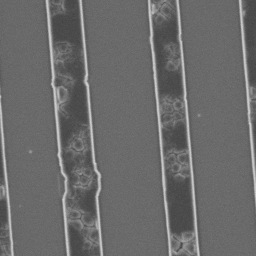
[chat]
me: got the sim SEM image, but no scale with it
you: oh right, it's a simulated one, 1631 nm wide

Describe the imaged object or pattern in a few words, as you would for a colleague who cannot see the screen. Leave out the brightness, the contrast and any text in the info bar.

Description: one or a few lines or trenches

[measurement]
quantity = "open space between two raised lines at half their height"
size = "61.5 pixels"